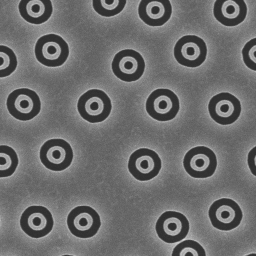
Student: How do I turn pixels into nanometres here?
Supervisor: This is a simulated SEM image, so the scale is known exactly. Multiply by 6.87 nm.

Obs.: a regular array of ring-shaped grooves with a dot in the middle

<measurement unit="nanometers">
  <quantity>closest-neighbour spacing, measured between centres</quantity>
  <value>381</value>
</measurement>